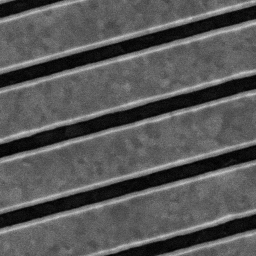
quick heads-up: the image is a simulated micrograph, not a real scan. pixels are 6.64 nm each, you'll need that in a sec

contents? one or a few lines or trenches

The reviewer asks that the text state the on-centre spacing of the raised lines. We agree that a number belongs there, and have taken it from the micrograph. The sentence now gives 450 nanometers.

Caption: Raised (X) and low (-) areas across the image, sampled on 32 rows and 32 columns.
-------XXXXXXXXXXXXXXXXXXXXXXXX-
----XXXXXXXXXXXXXXXXXXXXXXXX----
XXXXXXXXXXXXXXXXXXXXXXXX--------
XXXXXXXXXXXXXXXXXXXX---------XXX
XXXXXXXXXXXXXXXX---------XXXXXXX
XXXXXXXXXXXXX---------XXXXXXXXXX
XXXXXXXXX---------XXXXXXXXXXXXXX
XXXXX---------XXXXXXXXXXXXXXXXXX
XX--------XXXXXXXXXXXXXXXXXXXXXX
-------XXXXXXXXXXXXXXXXXXXXXXX--
---XXXXXXXXXXXXXXXXXXXXXXX------
XXXXXXXXXXXXXXXXXXXXXXX---------
XXXXXXXXXXXXXXXXXXX---------XXXX
XXXXXXXXXXXXXXX---------XXXXXXXX
XXXXXXXXXXXX---------XXXXXXXXXXX
XXXXXXXX---------XXXXXXXXXXXXXXX
XXXX---------XXXXXXXXXXXXXXXXXXX
X---------XXXXXXXXXXXXXXXXXXXXXX
------XXXXXXXXXXXXXXXXXXXXXXX---
--XXXXXXXXXXXXXXXXXXXXXXXX------
XXXXXXXXXXXXXXXXXXXXXX---------X
XXXXXXXXXXXXXXXXXX---------XXXXX
XXXXXXXXXXXXXXX---------XXXXXXXX
XXXXXXXXXXX---------XXXXXXXXXXXX
XXXXXXX---------XXXXXXXXXXXXXXXX
XXXX---------XXXXXXXXXXXXXXXXXXX
---------XXXXXXXXXXXXXXXXXXXXXXX
-----XXXXXXXXXXXXXXXXXXXXXXX----
--XXXXXXXXXXXXXXXXXXXXXXX-------
XXXXXXXXXXXXXXXXXXXXX---------XX
XXXXXXXXXXXXXXXXX---------XXXXXX
XXXXXXXXXXXXXX--------XXXXXXXXXX